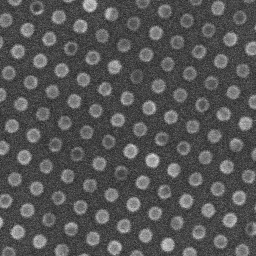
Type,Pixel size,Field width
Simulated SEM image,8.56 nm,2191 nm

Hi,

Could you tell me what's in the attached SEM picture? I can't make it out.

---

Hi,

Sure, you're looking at a regular array of raised bodies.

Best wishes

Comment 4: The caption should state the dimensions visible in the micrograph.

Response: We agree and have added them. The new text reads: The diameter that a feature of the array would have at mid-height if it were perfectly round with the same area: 104 nanometres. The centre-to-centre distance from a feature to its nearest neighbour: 202 nm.